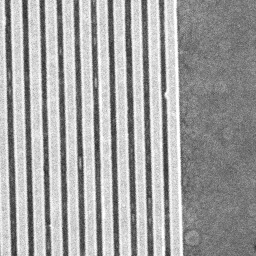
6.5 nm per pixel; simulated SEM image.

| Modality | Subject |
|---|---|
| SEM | parallel lines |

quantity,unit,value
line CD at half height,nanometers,63.3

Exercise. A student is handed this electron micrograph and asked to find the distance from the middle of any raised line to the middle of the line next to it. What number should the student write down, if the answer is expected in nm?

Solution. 111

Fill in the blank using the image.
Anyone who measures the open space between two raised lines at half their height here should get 51.9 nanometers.